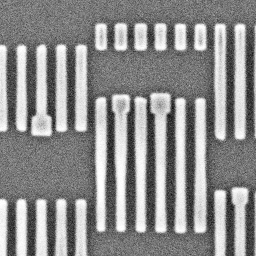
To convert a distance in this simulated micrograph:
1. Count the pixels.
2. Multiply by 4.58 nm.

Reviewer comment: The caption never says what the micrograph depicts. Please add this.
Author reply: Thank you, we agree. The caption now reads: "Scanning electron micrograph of wiring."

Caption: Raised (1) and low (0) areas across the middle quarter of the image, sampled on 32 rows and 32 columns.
00011000000000000000000000000000
00011000000000000000000000000000
00011000000000000000000000000000
00011000000000000000000000000000
00011000000000000000000000000000
00011100000000000000000000000000
00011100000000000000000000000000
00011100000000000000000000000000
00011100000011110010001111000000
00011100110011100011001111001100
00011100110011110011001111001100
00011100110011110011001111001100
00011100110001100011000111001100
00011100110001100011000110001100
00011100110001100011000110001100
00011100110001100011000110001100
00000000110001100011000110001100
00000000110001100011000110001100
00000000110001100011000110001100
00000000110001100011000110001100
00000000110001100011000110001100
00000000110001100011000110001100
00000000110001100011000110001100
00000000110001100011000110001100
00000000110001100011000110001100
00000000110001100011000110001100
00000000110001100011000110001100
00000000110001100011000110001100
00000000110001100011000110001100
00000000110001100011000110001100
00000000010001100011000110001100
00000000010001100011000110001100